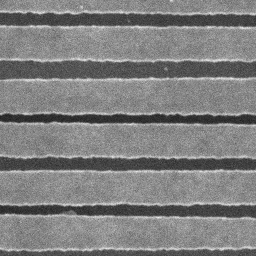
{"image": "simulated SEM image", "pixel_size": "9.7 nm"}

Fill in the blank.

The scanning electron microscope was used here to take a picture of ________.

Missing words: lines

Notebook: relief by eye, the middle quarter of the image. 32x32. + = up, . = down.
................................
................................
................................
................................
++++++++++++++++++++++++++++++++
++++++++++++++++++++++++++++++++
++++++++++++++++++++++++++++++++
++++++++++++++++++++++++++++++++
++++++++++++++++++++++++++++++++
++++++++++++++++++++++++++++++++
++++++++++++++++++++++++++++++++
++++++++++++++++++++++++++++++++
++++++..++++...+++++++...+++.+++
................................
................................
++++++++++++++++++++++++++++++++
++++++++++++++++++++++++++++++++
++++++++++++++++++++++++++++++++
++++++++++++++++++++++++++++++++
++++++++++++++++++++++++++++++++
++++++++++++++++++++++++++++++++
++++++++++++++++++++++++++++++++
++++++++++++++++++++++++++++++++
................+........++.+..+
................................
................................
................................
++++++++++++++++++++++++++++++++
++++++++++++++++++++++++++++++++
++++++++++++++++++++++++++++++++
++++++++++++++++++++++++++++++++
++++++++++++++++++++++++++++++++